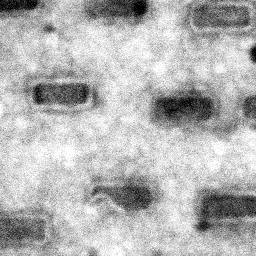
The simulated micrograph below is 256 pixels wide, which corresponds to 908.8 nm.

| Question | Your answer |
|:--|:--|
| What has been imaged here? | raised bodies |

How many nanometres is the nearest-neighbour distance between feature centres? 364